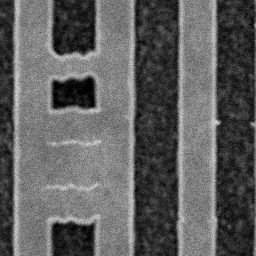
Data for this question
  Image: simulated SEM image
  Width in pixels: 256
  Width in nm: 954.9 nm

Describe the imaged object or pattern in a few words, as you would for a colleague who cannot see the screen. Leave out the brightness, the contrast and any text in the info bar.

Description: one or a few lines or trenches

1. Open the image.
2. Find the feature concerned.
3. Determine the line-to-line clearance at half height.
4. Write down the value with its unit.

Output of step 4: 179 nm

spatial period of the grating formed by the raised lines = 81.1 pixels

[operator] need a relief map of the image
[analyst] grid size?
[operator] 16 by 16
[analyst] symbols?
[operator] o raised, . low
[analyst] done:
.oo...oo...oo...
.oo...oo...oo...
.oo...oo...oo...
.ooooooo...oo...
.ooooooo...oo...
.oo...oo...oo...
.oo...oo...oo...
.ooooooo...oo...
.ooooooo...oo...
.ooooooo...oo...
.ooooooo...oo...
.ooooooo...oo...
.ooooooo...oo...
.ooooooo...oo...
.oo...oo...oo...
.oo...oo...oo...